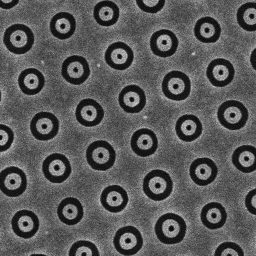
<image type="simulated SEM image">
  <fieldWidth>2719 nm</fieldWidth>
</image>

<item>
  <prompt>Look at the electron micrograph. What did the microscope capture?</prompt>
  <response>a regular array of ring-shaped grooves with a dot in the middle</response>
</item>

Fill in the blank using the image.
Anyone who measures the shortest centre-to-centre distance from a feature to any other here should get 473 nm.